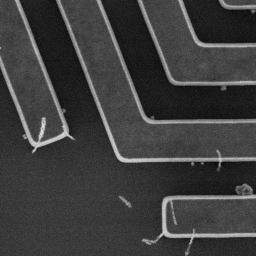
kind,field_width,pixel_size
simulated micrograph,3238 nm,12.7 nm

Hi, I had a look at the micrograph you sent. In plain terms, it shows groups of lines, slits or small figures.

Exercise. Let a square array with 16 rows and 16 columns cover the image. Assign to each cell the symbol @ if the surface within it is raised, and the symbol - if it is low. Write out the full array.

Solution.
@---@@---@@-----
@@--@@@--@@@----
@@---@@---@@----
@@---@@@--@@@@@@
@@@--@@@--@@@@@@
-@@---@@--------
-@@@--@@@-------
-@@@--@@@-------
--@@---@@@@@@@@@
-------@@@@@@@@@
----------------
----------------
-----------@@@@@
----------@@@@@@
----------@@@@@@
----------------